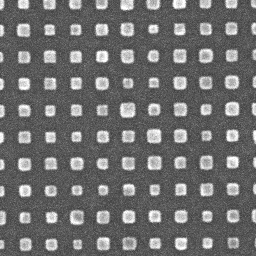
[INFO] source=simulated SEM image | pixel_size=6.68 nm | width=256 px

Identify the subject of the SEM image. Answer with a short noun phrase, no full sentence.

a regular array of raised bodies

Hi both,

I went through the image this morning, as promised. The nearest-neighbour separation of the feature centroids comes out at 171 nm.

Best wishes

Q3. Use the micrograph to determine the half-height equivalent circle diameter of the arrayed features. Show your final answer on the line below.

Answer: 76.5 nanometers